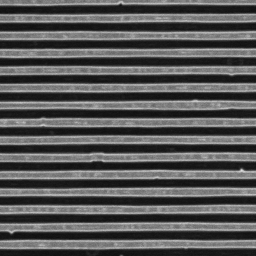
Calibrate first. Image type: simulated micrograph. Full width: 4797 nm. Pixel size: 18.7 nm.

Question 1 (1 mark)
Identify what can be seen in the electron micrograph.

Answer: parallel lines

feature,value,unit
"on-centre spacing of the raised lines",326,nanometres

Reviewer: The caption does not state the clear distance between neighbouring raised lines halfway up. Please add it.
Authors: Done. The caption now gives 0.164 µm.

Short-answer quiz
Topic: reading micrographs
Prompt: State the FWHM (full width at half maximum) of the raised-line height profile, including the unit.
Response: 166 nanometers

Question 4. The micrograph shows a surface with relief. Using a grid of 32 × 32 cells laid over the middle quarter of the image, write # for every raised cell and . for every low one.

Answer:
................................
################################
################################
................................
................................
################################
################################
................................
................................
################################
################################
................................
................................
................................
################################
################################
................................
................................
################################
################################
................................
................................
################################
################################
................................
................................
................................
################################
################################
................................
................................
################################